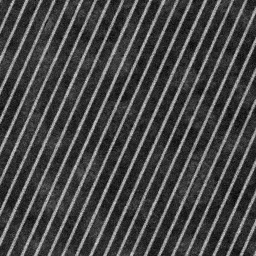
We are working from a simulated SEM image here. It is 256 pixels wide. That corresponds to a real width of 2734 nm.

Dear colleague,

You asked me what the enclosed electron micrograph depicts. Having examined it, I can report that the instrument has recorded parallel lines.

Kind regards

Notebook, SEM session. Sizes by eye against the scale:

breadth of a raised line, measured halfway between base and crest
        1.83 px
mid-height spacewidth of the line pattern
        116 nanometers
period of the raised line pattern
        134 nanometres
